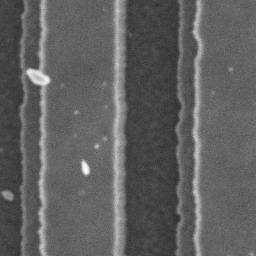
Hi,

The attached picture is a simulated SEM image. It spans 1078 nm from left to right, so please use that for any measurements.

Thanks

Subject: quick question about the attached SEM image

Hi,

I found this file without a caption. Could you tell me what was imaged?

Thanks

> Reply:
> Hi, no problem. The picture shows lines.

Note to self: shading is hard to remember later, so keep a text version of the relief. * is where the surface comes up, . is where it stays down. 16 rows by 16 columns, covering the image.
..*****....*****
.******....*****
.******....*****
.******....*****
.******....*****
.******....*****
.******....*****
.******....*****
.******....*****
.******....*****
.******....*****
.******....*****
.******....*****
.******....*****
.******....*****
.******....*****